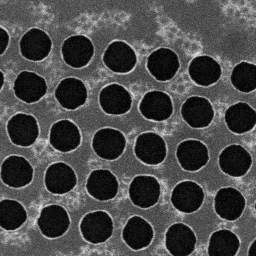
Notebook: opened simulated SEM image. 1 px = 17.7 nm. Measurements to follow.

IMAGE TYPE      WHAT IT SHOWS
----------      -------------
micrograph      a regular array of holes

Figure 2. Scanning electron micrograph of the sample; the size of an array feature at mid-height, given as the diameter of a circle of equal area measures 578 nm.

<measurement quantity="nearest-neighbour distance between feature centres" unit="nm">743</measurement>